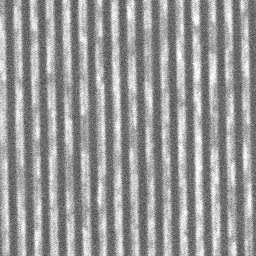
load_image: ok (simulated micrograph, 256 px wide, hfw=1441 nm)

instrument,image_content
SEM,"parallel lines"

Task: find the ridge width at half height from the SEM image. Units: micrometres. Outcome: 0.0338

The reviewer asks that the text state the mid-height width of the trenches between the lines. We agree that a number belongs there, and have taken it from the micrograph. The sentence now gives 0.0577 µm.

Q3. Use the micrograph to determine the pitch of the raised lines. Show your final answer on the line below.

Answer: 16.2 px